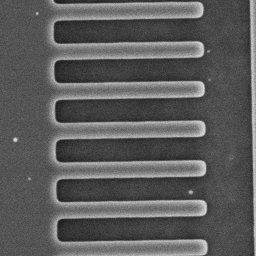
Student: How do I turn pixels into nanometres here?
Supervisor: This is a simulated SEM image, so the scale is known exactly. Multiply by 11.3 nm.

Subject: groups of lines, slits or small figures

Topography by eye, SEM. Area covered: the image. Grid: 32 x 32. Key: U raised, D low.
UUUUUUUUDUUUUUUUUUUUUUUUUDDDDDDU
UUUUUUUUUUUUUUUUUUUUUUUUUDDDDDDU
UUUUUUUUUDDDDDDDDDDDDDDDDDDDDDDU
UUUUUUUDDDDDDDDDDDDDDDDDDDDDDDDU
UUUUUUUDDDDDDDDDDDDDDDDDDDDDDDDU
UUUUUUUUDUUUUUUUUUUUUUUUUDDDDDDU
UUUUUUUUUUUUUUUUUUUUUUUUUDDDDDDU
UUUUUUUUDDDDDDDDDDDDDDDDDDDDDDDU
UUUUUUUDDDDDDDDDDDDDDDDDDDDDDDDU
UUUUUUUDDDDDDDDDDDDDDDDDDDDDDDDU
UUUUUUUUUUUUUUUUUUUUUUUUUDDDDDDD
UUUUUUUUUUUUUUUUUUUUUUUUUDDDDDDD
UUUUUUUUDDDDDDDDDDDDDDDDDDDDDDDD
UUUUUUUDDDDDDDDDDDDDDDDDDDDDDDDD
UUUUUUUDDDDDDDDDDDDDDDDDDDDDDDDD
UUUUUUUUUUUUUUUUUUUUUUUUUDDDDDDD
UUUUUUUUUUUUUUUUUUUUUUUUUUDDDDDD
UUUUUUUUDDDDDDDDDDDDDDDDDDDDDDDD
UUUUUUUDDDDDDDDDDDDDDDDDDDDDDDDD
UUUUUUUDDDDDDDDDDDDDDDDDDDDDDDDD
UUUUUUUUUUUUUUUUUUUUUUUUUUDDDDDD
UUUUUUUUUUUUUUUUUUUUUUUUUUDDDDDD
UUUUUUUDDDDDDDDDDDDDDDDDDDDDDDDD
UUUUUUUDDDDDDDDDDDDDDDDDDDDDDDDD
UUUUUUUDDDDDDDDDDDDDDDDDDDDDDDDD
UUUUUUUUUUUUUUUUUUUUUUUUUUDDDDDD
UUUUUUUUUUUUUUUUUUUUUUUUUUDDDDDD
UUUUUUUUDDDDDDDDDDDDDDDDDDDDDDDD
UUUUUUUDDDDDDDDDDDDDDDDDDDDDDDDD
UUUUUUUDDDDDDDDDDDDDDDDDDDDDDDDD
UUUUUUUUUUUUUUUUUUUUUUUUUUDDDDDD
UUUUUUUUUUUUUUUUUUUUUUUUUUDDDDDD